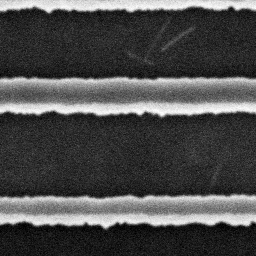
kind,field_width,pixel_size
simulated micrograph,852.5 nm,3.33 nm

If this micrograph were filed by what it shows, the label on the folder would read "lines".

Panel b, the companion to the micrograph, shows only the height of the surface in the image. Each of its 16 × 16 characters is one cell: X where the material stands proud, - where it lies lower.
X--XXXXXXXX--X--
----------------
----------------
----------------
----------------
XXXXXXXXXXXXXXXX
XXXXXXXXXXXXXXXX
----------------
----------------
----------------
----------------
----------------
XXXXXXXXXXXXXXXX
XXXXXXXXXXXXXXXX
----------------
----------------